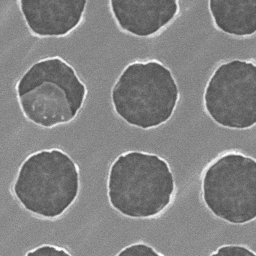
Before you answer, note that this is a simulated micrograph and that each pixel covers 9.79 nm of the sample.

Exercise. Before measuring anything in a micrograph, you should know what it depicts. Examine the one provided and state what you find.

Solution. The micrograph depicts holes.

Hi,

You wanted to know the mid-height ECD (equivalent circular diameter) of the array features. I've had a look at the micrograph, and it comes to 635 nm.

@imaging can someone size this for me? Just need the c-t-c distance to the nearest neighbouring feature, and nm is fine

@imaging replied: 884